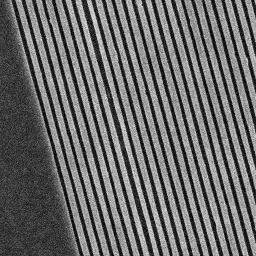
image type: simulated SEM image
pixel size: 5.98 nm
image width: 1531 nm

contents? parallel lines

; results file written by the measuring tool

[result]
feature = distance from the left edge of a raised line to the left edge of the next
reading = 57.6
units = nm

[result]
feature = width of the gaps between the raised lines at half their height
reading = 23.8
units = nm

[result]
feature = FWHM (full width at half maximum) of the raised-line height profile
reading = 0.0354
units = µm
